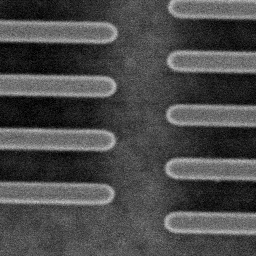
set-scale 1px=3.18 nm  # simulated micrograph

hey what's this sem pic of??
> groups of lines, slits or small figures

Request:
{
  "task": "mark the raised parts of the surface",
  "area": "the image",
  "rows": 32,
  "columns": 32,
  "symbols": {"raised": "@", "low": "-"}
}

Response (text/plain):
---------------------@@@@@@@@@@@
---------------------@@@@@@@@@@@
--------------------------------
@@@@@@@@@@@@@@------------------
@@@@@@@@@@@@@@------------------
--------------------------------
----------------------@@@-------
---------------------@@@@@@@@@@@
---------------------@@@@@@@@@@@
@@@@----------------------------
@@@@@@@@@@@@@@------------------
@@@@@@@@@@@@@@------------------
--------------------------------
---------------------@@@@@@@@@@@
---------------------@@@@@@@@@@@
----------------------@@@@@@@@@@
@@@@@@@@@@@@@@------------------
@@@@@@@@@@@@@@------------------
@@@@@@@@@@@@@@------------------
--------------------------------
---------------------@@@@@@@@@@@
---------------------@@@@@@@@@@@
--------------------------------
@@@@@@@@@@@@@@------------------
@@@@@@@@@@@@@@------------------
--------------------------------
--------------------------------
---------------------@@@@@@@@@@@
---------------------@@@@@@@@@@@
--------------------------------
--------------------------------
--------------------------------